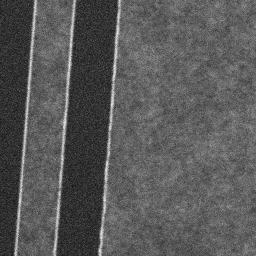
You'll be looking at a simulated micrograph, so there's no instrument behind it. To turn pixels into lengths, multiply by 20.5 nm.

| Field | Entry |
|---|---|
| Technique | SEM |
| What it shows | one or a few lines or trenches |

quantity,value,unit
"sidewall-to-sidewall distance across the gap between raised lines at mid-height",791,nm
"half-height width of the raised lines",931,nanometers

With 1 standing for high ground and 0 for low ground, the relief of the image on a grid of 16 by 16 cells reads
1100011000000000
1100011000000000
1100111000000000
1100111000000000
1100111000000000
1100111000000000
1100111000000000
1100111000000000
1100111000000000
1000111000000000
1000111000000000
1000111000000000
1000111000000000
1000110000000000
1000110000000000
1001110000000000